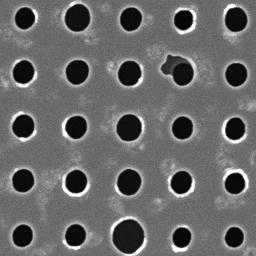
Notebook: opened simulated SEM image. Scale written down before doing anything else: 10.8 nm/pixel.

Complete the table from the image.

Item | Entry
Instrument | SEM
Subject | a regular array of holes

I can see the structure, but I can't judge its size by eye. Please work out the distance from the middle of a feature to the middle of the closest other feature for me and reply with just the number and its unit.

0.568 µm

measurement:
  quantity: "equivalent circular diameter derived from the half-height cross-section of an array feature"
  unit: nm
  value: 245